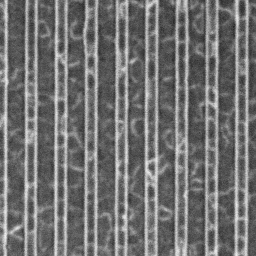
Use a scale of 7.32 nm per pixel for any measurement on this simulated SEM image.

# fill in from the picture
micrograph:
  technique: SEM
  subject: parallel lines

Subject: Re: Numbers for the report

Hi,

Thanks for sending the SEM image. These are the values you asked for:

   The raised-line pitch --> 0.22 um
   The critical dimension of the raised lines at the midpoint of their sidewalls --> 78.7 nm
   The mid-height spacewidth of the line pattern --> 136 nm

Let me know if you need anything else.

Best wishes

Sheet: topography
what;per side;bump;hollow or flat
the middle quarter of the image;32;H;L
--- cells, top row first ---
LLLLLLHHLLLLLHHHLLLLLHHLLLLLHHHL
HLLLLLHHLLLLLHHHLHLLLHHLLLLLHHHL
HLLLLLHHLLLLLHHHLLLLLHHLLLLLHHHL
LLLLLLHHLLLLLHHHLLLLLHHLLLLLHHHL
LLLLLLHHLLLLLHHHLLLLLHHLLLLLHHHL
LLLLLLHHLLLLLHHHLLLLLHHLLLLLHHHL
LLLLLLHHLLLLLHHHLLLLLHHLLLLLHHHL
LLLLLLHHLLLLLHHHLLLLLHHLLLLLHHHL
LLLLLLHHLLLLLHHHLLLLLHHLLLLLHHHL
LLLLLLHHLLLLLHHHLLLLLHHLLLLLHHHL
LLLLLLHHLLLLLHHHLLLLLHHLLLLLHHHL
LLLLLLHHLLLLLHHHLLLLLHHLLLLLHHHL
LLLLLLHHLLLLLHHHLLLLLHHLLLLLHHHL
LLLLLLHHLLLLLHHHLLLLLHHLLLLLHHHL
LLLLLLHHLLLLLHHHLLLLLHHLLLLLHHHL
LLLLLLHHLLLLLHHHLLLLLHHLLLLLHHHL
LLLLLLHHLLLLLHHHLLLLLHHLLLLLHHHL
LLLLLLHHLLLLLHHHLLLLLHHLLLLLHHHL
LLLLLLHHLLLLLHHHLLLLLHHLLLLLHHHL
LLLLLLHHLLLLLHHHLLLLLHHLLLLLHHHL
LLLLLLHHLLLLLHHHLLLLLHHLLLLLHHHL
LLLLLLHHLLLLLHHHLLLLLHHLLLLLHHHL
LLLLLLHHLLLLLHHHLLLLLHHLLLLLHHHL
LLLLLLHHLLLLLHHHLLLLLHHLLLLLHHHL
LLLLLLHHLLLLLHHHLLLLLHHLLLLLHHHL
LLLLLLHHLLLLLHHHLLLLLHHLLLLLHHHL
LLLLLLHHLLLLLHHHLLLLLHHLLLLLHHHL
LLLLLLHHLLLLLHHHLLLLLHHLLLLLHHHL
LLLLLLHHLLLLLHHHLLLLLHHLLLLLHHHL
LLLLLLHHLLLLLHHHLLLLHHHLLLLLHHHL
LLLLLLHHLLLLLHHHLLLLHHHLLLLLHHHL
LLLLLLHHLLLLLHHHLLLLHHHLLLLLHHHL